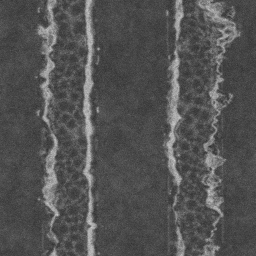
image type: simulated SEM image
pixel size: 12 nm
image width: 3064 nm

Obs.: one or a few lines or trenches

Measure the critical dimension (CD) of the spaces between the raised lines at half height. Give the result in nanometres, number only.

1030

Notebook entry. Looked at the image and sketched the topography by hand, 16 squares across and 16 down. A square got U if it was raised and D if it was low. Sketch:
DDDUUDDDDDDUUDDD
DDDUUUDDDDDUUUDD
DDDUUUDDDDDUUUDD
DDDUUUDDDDDUUUDD
DDDUUUDDDDDUUUDD
DDDUUUDDDDDUUUDD
DDDUUDDDDDDUUUDD
DDDUUDDDDDDUUUDD
DDDUUUDDDDDUUDDD
DDDUUDDDDDDUUDDD
DDDUUDDDDDDUUDDD
DDDUUUDDDDDUUDDD
DDDUUUDDDDDUUDDD
DDDUUUDDDDDUUUDD
DDDUUUDDDDDUUDDD
DDDUUUDDDDDUUDDD